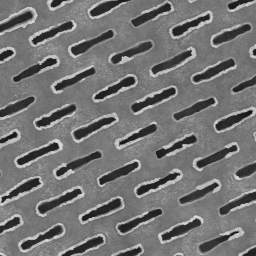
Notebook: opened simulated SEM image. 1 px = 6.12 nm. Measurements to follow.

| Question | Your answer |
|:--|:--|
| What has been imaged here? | a regular array of holes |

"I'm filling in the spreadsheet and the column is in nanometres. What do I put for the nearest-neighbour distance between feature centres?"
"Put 241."